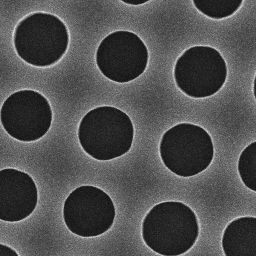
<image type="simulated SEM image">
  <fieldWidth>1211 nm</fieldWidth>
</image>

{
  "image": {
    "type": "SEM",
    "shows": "holes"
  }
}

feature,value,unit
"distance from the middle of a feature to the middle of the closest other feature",79.2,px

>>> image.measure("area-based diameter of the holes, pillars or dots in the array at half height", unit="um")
0.249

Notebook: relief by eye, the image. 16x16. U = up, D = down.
UUUUUUUUUUUUDDDU
UDDDUUUUUUUUUUUU
UDDDUUDDDUUUUUUU
UDDDUUDDDUUDDDUU
UUUUUUDDDUUDDDUU
UUUUUUUUUUUDDDUU
DDDUUUUUUUUUUUUU
DDDUUDDDUUUUUUUU
UDDUUDDDUUDDDUUU
UUUUUDDDUUDDDUUD
UUUUUUUUUUUDDUUD
DDUUUUUUUUUUUUUD
DDUUDDDUUUUUUUUU
DDUUDDDUUDDDUUUU
UUUUUDUUUDDDUUDD
DUUUUUUUUDDDUUDD